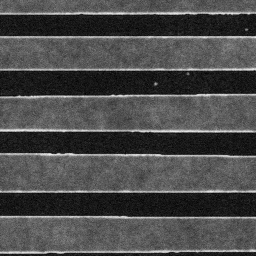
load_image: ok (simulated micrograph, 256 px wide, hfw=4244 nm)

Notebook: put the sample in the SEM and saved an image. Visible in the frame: lines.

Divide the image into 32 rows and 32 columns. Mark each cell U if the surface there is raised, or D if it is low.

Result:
UUUUUUUUUUUUUUUUUUUUUUUUUUUUUUUU
UUUUUUUUUUUUUUUUUUUUUUUUUUUUUUUU
DDDDDDDDDDDDDDDDDDDDDDDDDDDDDDDD
DDDDDDDDDDDDDDDDDDDDDDDDDDDDDDDD
DDDDDDDDDDDDDDDDDDDDDDDDDDDDDDDD
UUUUUUUUUUUUUUUUUUUUUUUUUUUUUUUU
UUUUUUUUUUUUUUUUUUUUUUUUUUUUUUUU
UUUUUUUUUUUUUUUUUUUUUUUUUUUUUUUU
UUUUUUUUUUUUUUUUUUUUUUUUUUUUUUUU
DDDDDDDDDDDDDDDDDDDDDDDDDDDDDDDD
DDDDDDDDDDDDDDDDDDDDDDDDDDDDDDDD
DDDDDDDDDDDDDDDDDDDDDDDDDDDDDDDD
UUUUUUUUUUUUUUUUUUUUUUUUUUUUUUUU
UUUUUUUUUUUUUUUUUUUUUUUUUUUUUUUU
UUUUUUUUUUUUUUUUUUUUUUUUUUUUUUUU
UUUUUUUUUUUUUUUUUUUUUUUUUUUUUUUU
DDDDDDDDDDDDDDDDDDDDDDDDDDDDDDDD
DDDDDDDDDDDDDDDDDDDDDDDDDDDDDDDD
DDDDDDDDDDDDDDDDDDDDDDDDDDDDDDDD
UUUUUUUUUUUUUUUUUUUUUUUUUUUUUDDD
UUUUUUUUUUUUUUUUUUUUUUUUUUUUUUUU
UUUUUUUUUUUUUUUUUUUUUUUUUUUUUUUU
UUUUUUUUUUUUUUUUUUUUUUUUUUUUUUUU
UUUUUUUUUUUUUUUUUUUUUUUUUUUUUUUU
DDDDDDDDDDDDDDDDDDDDDDDDDDDDDDDD
DDDDDDDDDDDDDDDDDDDDDDDDDDDDDDDD
DDDDDDDDDDDDDDDDDDDDDDDDDDDDDDDD
UUUUUUUUUUUUUUUUUUUUUUUUUUUUUUUU
UUUUUUUUUUUUUUUUUUUUUUUUUUUUUUUU
UUUUUUUUUUUUUUUUUUUUUUUUUUUUUUUU
UUUUUUUUUUUUUUUUUUUUUUUUUUUUUUUU
UUUUUUUUUUUUUUUUUUUUUDDDDDDDDDDD